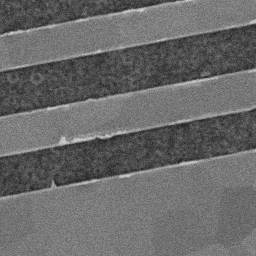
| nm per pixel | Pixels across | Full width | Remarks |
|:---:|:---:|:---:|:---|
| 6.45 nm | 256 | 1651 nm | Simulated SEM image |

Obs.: one or a few lines or trenches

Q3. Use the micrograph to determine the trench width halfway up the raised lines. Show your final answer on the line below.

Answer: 263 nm